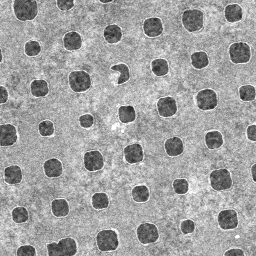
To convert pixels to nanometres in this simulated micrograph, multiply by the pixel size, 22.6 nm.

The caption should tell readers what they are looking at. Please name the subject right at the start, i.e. a regular array of raised bodies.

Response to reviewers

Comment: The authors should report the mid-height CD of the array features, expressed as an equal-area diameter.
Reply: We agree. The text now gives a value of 0.455 um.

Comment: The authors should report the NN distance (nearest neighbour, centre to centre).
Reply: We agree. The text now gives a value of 909 nanometers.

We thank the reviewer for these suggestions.